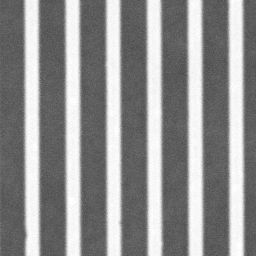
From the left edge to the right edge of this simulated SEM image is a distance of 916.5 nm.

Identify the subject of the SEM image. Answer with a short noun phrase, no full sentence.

parallel lines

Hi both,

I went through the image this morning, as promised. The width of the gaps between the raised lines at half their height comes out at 0.101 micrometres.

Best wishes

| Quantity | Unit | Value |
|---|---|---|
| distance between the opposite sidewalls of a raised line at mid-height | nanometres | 44.3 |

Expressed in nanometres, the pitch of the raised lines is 146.